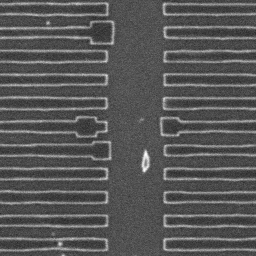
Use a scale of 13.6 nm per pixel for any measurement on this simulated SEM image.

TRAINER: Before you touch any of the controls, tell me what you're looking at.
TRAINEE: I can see wiring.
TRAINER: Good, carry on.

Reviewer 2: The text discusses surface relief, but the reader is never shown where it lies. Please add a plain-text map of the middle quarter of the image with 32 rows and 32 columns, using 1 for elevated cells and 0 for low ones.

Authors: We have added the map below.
00000000000000000000000000000000
00000000000000000000000000000000
00000000000000000000000000000000
11111111111000000000000001111111
11111111111000000000000001111111
00000000000000000000000000000000
00000000000000000000000000000000
00000000000000000000000000000000
00000000000000000000000000000000
11111111111000000000000001111111
11111111111000000000000001111111
00000000000000000000000000000000
00000000000000000000000000000000
00011111000000000000000000000000
11111111111000000000000011111111
11111111111000000000000011111111
11111111111000000000000011111111
00011111000000000000000011111000
00000000000000000000000000000000
00000001111000000000000000000000
11111111111000000000000001111111
11111111111000000000000001111111
11111111111000000000000001111111
00000001111000000000100000000000
00000000000000000000100000000000
00000000000000000000100000000000
11111111111000000000000001111111
11111111111000000000000001111111
11111111111000000000000001111111
00000000000000000000000000000000
00000000000000000000000000000000
00000000000000000000000000000000